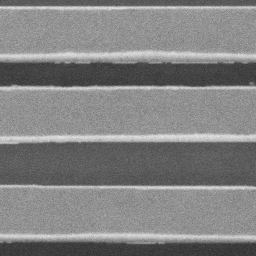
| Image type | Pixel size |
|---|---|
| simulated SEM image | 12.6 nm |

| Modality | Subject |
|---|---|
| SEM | lines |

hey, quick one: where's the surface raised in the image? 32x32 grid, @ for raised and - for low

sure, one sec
--------------------------------
@@@@@@@@@@@@@@@@@@@@@@@@@@@@@@@@
@@@@@@@@@@@@@@@@@@@@@@@@@@@@@@@@
@@@@@@@@@@@@@@@@@@@@@@@@@@@@@@@@
@@@@@@@@@@@@@@@@@@@@@@@@@@@@@@@@
@@@@@@@@@@@@@@@@@@@@@@@@@@@@@@@@
@@@@@@@@@@@@@@@@@@@@@@@@@@@@@@@@
--------------------------------
--------------------------------
--------------------------------
--------------------------------
@@@@@@@@@@@@@@@@@@@@@@@@@@@@@@@@
@@@@@@@@@@@@@@@@@@@@@@@@@@@@@@@@
@@@@@@@@@@@@@@@@@@@@@@@@@@@@@@@@
@@@@@@@@@@@@@@@@@@@@@@@@@@@@@@@@
@@@@@@@@@@@@@@@@@@@@@@@@@@@@@@@@
@@@@@@@@@@@@@@@@@@@@@@@@@@@@@@@@
@@@@@---------------------------
--------------------------------
--------------------------------
--------------------------------
--------------------------------
--------------------------------
@@@@@@@@@@@@@@@@@@@@@@@@@@@@@@@@
@@@@@@@@@@@@@@@@@@@@@@@@@@@@@@@@
@@@@@@@@@@@@@@@@@@@@@@@@@@@@@@@@
@@@@@@@@@@@@@@@@@@@@@@@@@@@@@@@@
@@@@@@@@@@@@@@@@@@@@@@@@@@@@@@@@
@@@@@@@@@@@@@@@@@@@@@@@@@@@@@@@@
@@@@@@@@@@@@@@@@@@@@@@@@@@@@@@@@
--------------------------------
--------------------------------